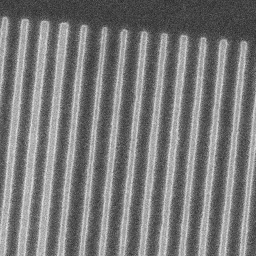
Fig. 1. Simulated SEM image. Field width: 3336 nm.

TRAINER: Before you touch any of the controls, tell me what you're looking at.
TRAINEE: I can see parallel lines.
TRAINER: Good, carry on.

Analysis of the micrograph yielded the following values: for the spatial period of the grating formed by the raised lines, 0.261 microns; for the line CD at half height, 194 nm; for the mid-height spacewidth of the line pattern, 58.3 nm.